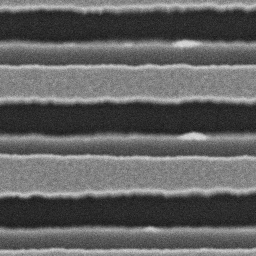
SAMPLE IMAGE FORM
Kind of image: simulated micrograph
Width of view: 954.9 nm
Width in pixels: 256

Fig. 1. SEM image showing lines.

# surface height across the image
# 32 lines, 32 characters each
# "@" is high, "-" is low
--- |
@@@@@@@@@@@@@@@@@@@@@@@@@@@@@@@@
--------------------------------
--------------------------------
--------------------------------
--------------------------------
--------@@-----@@----@@@@@------
@@@@@@@@@@@@@@@@@@@@@@@@@@@@@@@@
@@@@@@@@@@@@@@@@@@@@@@@@@@@@@@@@
@@@@@@@@@@@@@@@@@@@@@@@@@@@@@@@@
@@@@@@@@@@@@@@@@@@@@@@@@@@@@@@@@
@@@@@@@@@@@@@@@@@@@@@@@@@@@@@@@@
@@@@@@@@@@@@@@@@@@@@@@@@@@@@@@@@
@@@@@@@@@@@@@@@@@--@@@@@---@@@@@
--------------------------------
--------------------------------
--------------------------------
--------------------------------
@@@@@@@@@@@@@@@@@@@@@@@@@@@@@@@@
@@@@@@@@@@@@@@@@@@@@@@@@@@@@@@@@
@@@@@@@@@@@@@@@@@@@@@@@@@@@@@@@@
@@@@@@@@@@@@@@@@@@@@@@@@@@@@@@@@
@@@@@@@@@@@@@@@@@@@@@@@@@@@@@@@@
@@@@@@@@@@@@@@@@@@@@@@@@@@@@@@@@
@@@@@@@@@@@@@@@@@@@@@@@@@@@@@@@@
--------------------------------
--------------------------------
--------------------------------
--------------------------------
------------------@@------------
@@@@@@@@@@@@@@@@@@@@@@@@@@@@@@@@
@@@@@@@@@@@@@@@@@@@@@@@@@@@@@@@@
@@@@@@@@@@@@@@@@@@@@@@@@@@@@@@@@